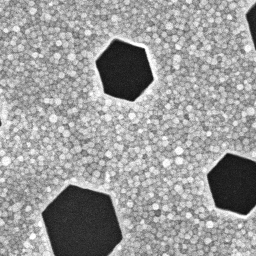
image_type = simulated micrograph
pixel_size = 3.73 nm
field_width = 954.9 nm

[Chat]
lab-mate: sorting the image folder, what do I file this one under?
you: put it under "holes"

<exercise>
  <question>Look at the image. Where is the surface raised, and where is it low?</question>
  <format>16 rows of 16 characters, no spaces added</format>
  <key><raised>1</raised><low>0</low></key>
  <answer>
1111111111111111
1111111111111111
1111111111111111
1111110001111111
1111110001111111
1111110001111111
1111111111111111
1111111111111111
1111111111111111
1111111111111111
1111111111111000
1111111111111000
1110000111111000
1110000111111111
1110000011111111
1110000111111111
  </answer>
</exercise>